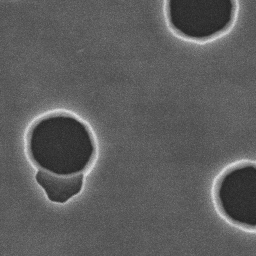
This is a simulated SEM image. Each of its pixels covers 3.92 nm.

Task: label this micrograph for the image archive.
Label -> holes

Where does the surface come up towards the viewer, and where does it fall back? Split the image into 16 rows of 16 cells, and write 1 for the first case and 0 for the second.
1111111111000001
1111111111100011
1111111111111111
1111111111111111
1111111111111111
1111111111111111
1111111111111111
1100011111111111
1100001111111111
1100001111111111
1100011111111110
1100011111111100
1110111111111100
1111111111111100
1111111111111111
1111111111111111